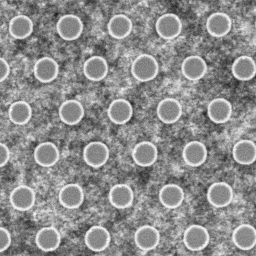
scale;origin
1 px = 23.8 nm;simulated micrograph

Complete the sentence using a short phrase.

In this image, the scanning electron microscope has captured a regular array of raised bodies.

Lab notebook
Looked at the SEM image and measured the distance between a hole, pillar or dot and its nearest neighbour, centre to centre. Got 1150 nm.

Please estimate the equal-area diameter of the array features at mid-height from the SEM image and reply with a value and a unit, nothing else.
558 nanometers